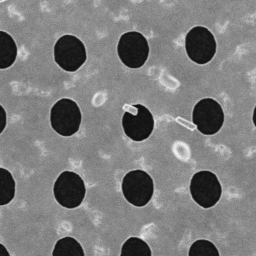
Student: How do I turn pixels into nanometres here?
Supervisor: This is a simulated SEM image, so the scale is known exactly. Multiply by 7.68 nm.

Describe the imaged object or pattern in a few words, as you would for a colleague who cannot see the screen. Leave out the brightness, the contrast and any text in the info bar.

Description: a regular array of holes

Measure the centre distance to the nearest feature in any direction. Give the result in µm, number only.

0.494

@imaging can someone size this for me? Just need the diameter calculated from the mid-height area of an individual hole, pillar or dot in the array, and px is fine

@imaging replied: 34.3